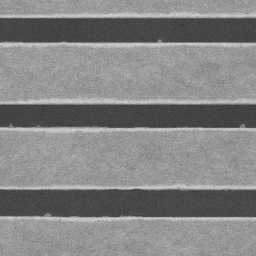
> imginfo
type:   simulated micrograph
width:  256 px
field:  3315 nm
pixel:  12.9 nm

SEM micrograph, lines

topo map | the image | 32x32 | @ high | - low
@@@@@@@@@@@@@@@@@@@@@@@@@@@@@@@@
@@@@@@@@@@@@@@@@@@@@@@@@@@@@@@@@
--------------------------------
--------------------------------
--------------------------------
@@@@@@@@@@@@@@@@@@@@@@@@@@@@@@@@
@@@@@@@@@@@@@@@@@@@@@@@@@@@@@@@@
@@@@@@@@@@@@@@@@@@@@@@@@@@@@@@@@
@@@@@@@@@@@@@@@@@@@@@@@@@@@@@@@@
@@@@@@@@@@@@@@@@@@@@@@@@@@@@@@@@
@@@@@@@@@@@@@@@@@@@@@@@@@@@@@@@@
@@@@@@@@@@@@@@@@@@@@@@@@@@@@@@@@
@@@@@@@@@@@@@@@@@@@@@@@@@@@@@@@@
--------------------------------
--------------------------------
--------------------------------
@@@@@@@@@@@@@@@@@@@@@@@@@@@@@@@@
@@@@@@@@@@@@@@@@@@@@@@@@@@@@@@@@
@@@@@@@@@@@@@@@@@@@@@@@@@@@@@@@@
@@@@@@@@@@@@@@@@@@@@@@@@@@@@@@@@
@@@@@@@@@@@@@@@@@@@@@@@@@@@@@@@@
@@@@@@@@@@@@@@@@@@@@@@@@@@@@@@@@
@@@@@@@@@@@@@@@@@@@@@@@@@@@@@@@@
@@@@@@@@@@@@@@@@@@@@@@@@@@@@@@@@
--------------------------------
--------------------------------
--------------------------------
@@@@@@@@@@@@@@@@@@@@@@@@@@@@@@@@
@@@@@@@@@@@@@@@@@@@@@@@@@@@@@@@@
@@@@@@@@@@@@@@@@@@@@@@@@@@@@@@@@
@@@@@@@@@@@@@@@@@@@@@@@@@@@@@@@@
@@@@@@@@@@@@@@@@@@@@@@@@@@@@@@@@